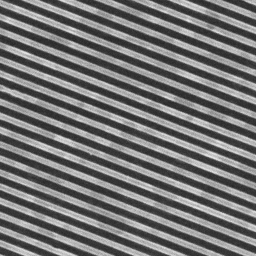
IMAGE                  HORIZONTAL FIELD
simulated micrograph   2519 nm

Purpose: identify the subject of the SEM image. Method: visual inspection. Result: parallel lines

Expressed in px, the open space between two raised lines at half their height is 7.82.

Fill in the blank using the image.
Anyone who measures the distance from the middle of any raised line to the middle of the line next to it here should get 130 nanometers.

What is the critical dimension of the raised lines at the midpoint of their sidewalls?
52.8 nm